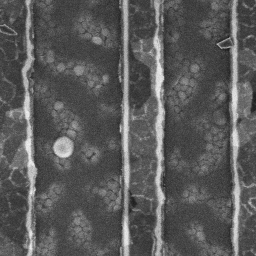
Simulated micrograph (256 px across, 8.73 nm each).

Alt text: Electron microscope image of one or a few lines or trenches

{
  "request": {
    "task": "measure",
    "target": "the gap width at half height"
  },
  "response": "758 nm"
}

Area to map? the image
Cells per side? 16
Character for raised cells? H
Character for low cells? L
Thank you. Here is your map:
HHLLLLLLHHLLLLLH
HHLLLLLLHHLLLLLH
HHLLLLLLHHLLLLLH
HHLLLLLLHHLLLLLH
HHLLLLLLHHLLLLLH
HHLLLLLLHHLLLLLH
HHLLLLLLHHLLLLLH
HHLLLLLLHHLLLLLH
HHLLLLLLHHLLLLLH
HHLLLLLLHHLLLLLH
HHLLLLLLHHLLLLLH
HHLLLLLLHHLLLLLH
HHLLLLLLHHLLLLLH
HHLLLLLLHHLLLLLH
HHLLLLLLHHLLLLLH
HHLLLLLLHHLLLLLH